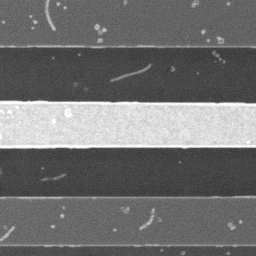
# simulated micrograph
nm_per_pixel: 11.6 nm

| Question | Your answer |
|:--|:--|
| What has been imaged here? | lines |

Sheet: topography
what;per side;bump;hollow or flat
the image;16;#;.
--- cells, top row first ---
################
################
################
................
................
................
###############.
################
################
................
................
................
################
################
################
................